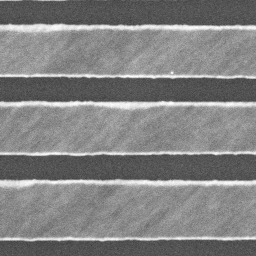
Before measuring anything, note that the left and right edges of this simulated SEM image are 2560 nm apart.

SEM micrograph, lines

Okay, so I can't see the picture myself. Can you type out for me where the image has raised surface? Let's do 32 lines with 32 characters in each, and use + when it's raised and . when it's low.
................................
................................
................................
++++++++++++++++++++++++++++++++
++++++++++++++++++++++++++++++++
++++++++++++++++++++++++++++++++
++++++++++++++++++++++++++++++++
++++++++++++++++++++++++++++++++
++++++++++++++++++++++++++++++++
++++++++++++++++++++++++++++++++
................................
................................
................................
++++++++++++++++++++++++++++++++
++++++++++++++++++++++++++++++++
++++++++++++++++++++++++++++++++
++++++++++++++++++++++++++++++++
++++++++++++++++++++++++++++++++
++++++++++++++++++++++++++++++++
................................
................................
................................
................................
++++++++++++++++++++++++++++++++
++++++++++++++++++++++++++++++++
++++++++++++++++++++++++++++++++
++++++++++++++++++++++++++++++++
++++++++++++++++++++++++++++++++
++++++++++++++++++++++++++++++++
++++++++++++++++++++++++++++++++
................................
................................